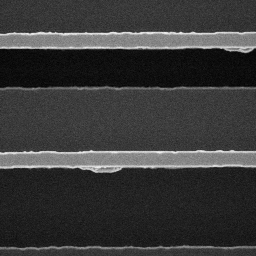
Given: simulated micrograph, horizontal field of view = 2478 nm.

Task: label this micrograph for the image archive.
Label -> lines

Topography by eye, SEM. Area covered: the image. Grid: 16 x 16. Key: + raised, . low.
++++++++++++++++
++++++++++++++++
++++++++++++++++
................
................
...+..+....+++++
++++++++++++++++
++++++++++++++++
++++++++++++++++
++++++++++++++++
+....+++........
................
................
................
................
...+++++++++++++